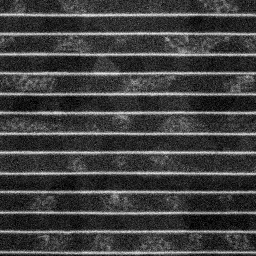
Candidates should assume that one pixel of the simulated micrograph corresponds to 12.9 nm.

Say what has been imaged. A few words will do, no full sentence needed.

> parallel lines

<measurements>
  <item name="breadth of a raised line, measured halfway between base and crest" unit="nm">249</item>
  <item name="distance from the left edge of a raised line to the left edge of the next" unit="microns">0.512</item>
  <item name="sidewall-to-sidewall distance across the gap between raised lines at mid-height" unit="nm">274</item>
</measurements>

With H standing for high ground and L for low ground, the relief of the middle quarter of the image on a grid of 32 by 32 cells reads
HHHHHHHHHHHHHHHHHHHHHHHHHHHHHHHH
HHHHHHHHHHHHHHHHHHHHHHHHHHHHHHHH
LLLLLLLLLLLLLLLLLLLLLLLLLLLLLLLL
LLLLLLLLLLLLLLLLLLLLLLLLLLLLLLLL
LLLLLLLLLLLLLLLLLLLLLLLLLLLLLLLL
LLLLLLLLLLLLLLLLLLLLLLLLLLLLLLLL
LLLLLLLLLLLLLLLLLLLLLLLLLLLLLLLL
LLLLHHHHLLLLLLLLLLLLLLLLLLLLLLLL
HHHHHHHHHHHHHHHHHHHHHHHHHHHHHHHH
HHHHHHHHHHHHHHHHHHHHHHHHHHHHHHHH
HHHHHHHHHHHHHHHHHHHHHHHHHHHHHHHH
HHHHHHHHHHHHHHHHHHHHHHHHHHHHHHHH
LLLLLLLLLLLLLLLLLLLLLLLLLLLLLLLL
LLLLLLLLLLLLLLLLLLLLLLLLLLLLLLLL
LLLLLLLLLLLLLLLLLLLLLLLLLLLLLLLL
LLLLLLLLLLLLLLLLLLLLLLLLLLLLLLLL
LLLLLLLLLLLLLLLLLLLLLLLLLLLLLLLL
HHHHHHHHHHHHHHHHLLLLLLLLLHHHHHHH
HHHHHHHHHHHHHHHHHHHHHHHHHHHHHHHH
HHHHHHHHHHHHHHHHHHHHHHHHHHHHHHHH
HHHHHHHHHHHHHHHHHHHHHHHHHHHHHHHH
HHHHHHHHHHHHHHHHHHHHHHHHHHHHHHHH
LLLLLLLLLLLLLLLLLLLLLLLLLLLLLLLL
LLLLLLLLLLLLLLLLLLLLLLLLLLLLLLLL
LLLLLLLLLLLLLLLLLLLLLLLLLLLLLLLL
LLLLLLLLLLLLLLLLLLLLLLLLLLLLLLLL
LLLLLLLLLLLLLLLLLLLLLLLLLLLLLLLL
HHHHHHHHHHHHHHHHHHHHHHHHHHHHHHHH
HHHHHHHHHHHHHHHHHHHHHHHHHHHHHHHH
HHHHHHHHHHHHHHHHHHHHHHHHHHHHHHHH
HHHHHHHHHHHHHHHHHHHHHHHHHHHHHHHH
HHHHHHHHHHHHHHHHHHHHHHHHHHHHHHHH